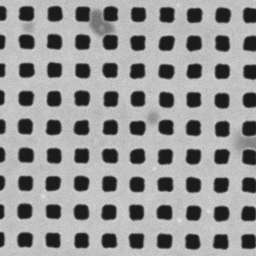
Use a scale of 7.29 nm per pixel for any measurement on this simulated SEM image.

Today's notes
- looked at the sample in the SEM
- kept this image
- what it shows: a regular array of holes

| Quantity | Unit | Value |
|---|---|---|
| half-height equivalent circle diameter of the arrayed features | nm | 112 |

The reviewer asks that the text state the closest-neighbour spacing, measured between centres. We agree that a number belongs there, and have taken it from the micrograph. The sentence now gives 0.201 microns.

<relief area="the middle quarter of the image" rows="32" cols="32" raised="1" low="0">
11100011110001111000111100011110
11100001110001111000111100001110
11100011110001111000111100011110
11111111111111111011111110011111
11111111111111111111111111111111
11111111111111111111111111111111
11111111111111111111111111111111
11100011110000111000111100011110
11100011110000111000111100011110
11100011110000111000111100011110
11111111111001111000111100011110
11111111111111111111111111111111
11111111111111111111111111111111
11111111111111111111111111111111
11100011110001111000111100011110
11100011110001110000111100011110
11000011110001111000111100011110
11100011110001111100111110011110
11111111111111111111111111111111
11111111111111111111111111111111
11111111111111111111111111111111
11100011110001111100111100011110
11100011110001111000111100011100
11100011110001111000111100011100
11100011111001111000111100011110
11111111111111111111111111111111
11111111111111111111111111111111
11111111111111111111111111111111
11100011110001111001111110111110
11100011110001110000111000011100
11100011110001110000111000011100
11100011110001111000111100011110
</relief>